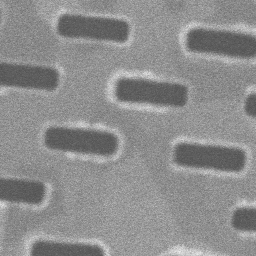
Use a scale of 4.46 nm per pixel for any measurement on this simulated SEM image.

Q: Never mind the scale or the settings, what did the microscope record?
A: holes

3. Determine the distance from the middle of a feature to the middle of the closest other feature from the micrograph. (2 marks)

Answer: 86.4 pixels